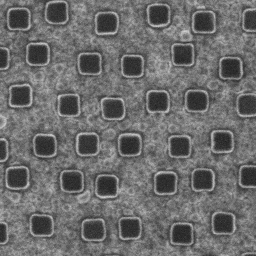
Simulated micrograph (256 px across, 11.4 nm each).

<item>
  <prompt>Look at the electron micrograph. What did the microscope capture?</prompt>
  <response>a regular array of raised bodies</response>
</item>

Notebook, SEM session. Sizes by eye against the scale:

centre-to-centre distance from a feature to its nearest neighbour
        458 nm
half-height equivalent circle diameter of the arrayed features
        24.5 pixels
